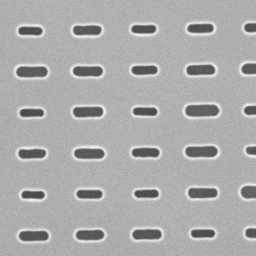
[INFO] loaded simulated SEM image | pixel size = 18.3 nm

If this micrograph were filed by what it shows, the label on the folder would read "a regular array of holes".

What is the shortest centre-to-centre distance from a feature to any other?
748 nm